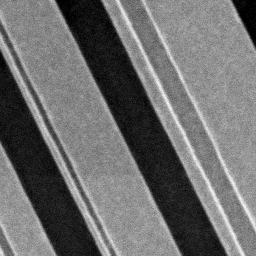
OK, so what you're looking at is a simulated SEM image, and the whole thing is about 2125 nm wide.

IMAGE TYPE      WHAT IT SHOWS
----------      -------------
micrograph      lines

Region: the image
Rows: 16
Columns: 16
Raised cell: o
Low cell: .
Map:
oooo...oooooooo.
oooo...oooooooo.
ooooo...oooooooo
ooooo...oooooooo
.ooooo...ooooooo
.ooooo...ooooooo
..ooooo...oooooo
..ooooo...oooooo
...ooooo...ooooo
...ooooo...ooooo
o...ooooo...oooo
o...ooooo...oooo
oo...ooooo...ooo
oo...ooooo...ooo
ooo...ooooo...oo
ooo...ooooo...oo